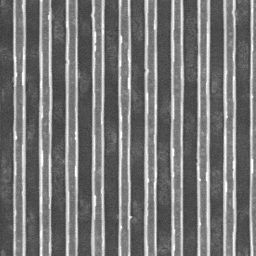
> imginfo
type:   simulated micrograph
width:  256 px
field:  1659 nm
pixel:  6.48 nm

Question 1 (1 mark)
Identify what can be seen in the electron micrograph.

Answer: parallel lines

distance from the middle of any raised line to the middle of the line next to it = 171 nm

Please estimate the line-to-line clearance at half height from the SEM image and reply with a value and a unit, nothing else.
0.101 µm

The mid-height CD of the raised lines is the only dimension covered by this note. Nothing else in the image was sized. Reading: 68.1 nm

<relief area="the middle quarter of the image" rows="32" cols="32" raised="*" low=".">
.**....***....***...***....***..
.**....***....***...***....***..
.**....***....***...***....***..
.**....***....***...***....***..
.**....***....***...***....***..
.**....***....***...***....***..
.**....***....***....**....***..
.**....***....***....**....***..
.**....***....***....**....***..
.**....***....***....**....***..
.**....***....***....**....***..
.**....***....**.....**....***..
.**....***....**.....**....***..
.**....***....**.....**....***..
.**....***....**.....**....***..
.**....***....**.....**....***..
.**....***....**.....**....***..
.**....***....**.....**....**...
.**....***....**.....**....**...
.**....***....**.....**....**...
.**....***....**....***....***..
.**....***....**....***....***..
.**....***....**....***....***..
.**....***....**....***....***..
.**....***....**....***....***..
.**....***....**....***....***..
.**....***....**....***....***..
.**....***....**....***....***..
.**....***....**....***....***..
.**....***....**....***....***..
.**....***....**....***....***..
.**....***....**.....**....***..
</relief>